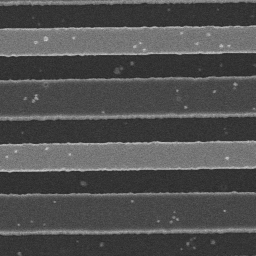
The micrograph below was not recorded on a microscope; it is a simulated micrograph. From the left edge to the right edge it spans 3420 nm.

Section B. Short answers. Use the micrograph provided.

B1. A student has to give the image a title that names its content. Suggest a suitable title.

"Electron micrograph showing lines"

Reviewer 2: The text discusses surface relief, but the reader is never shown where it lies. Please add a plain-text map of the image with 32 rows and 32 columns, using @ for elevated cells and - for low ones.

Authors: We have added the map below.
@-------------------------------
--------------------------------
--------------------------------
------@@@@@@@@@@@@@@@@@@@@@@@@@@
@@@@@@@@@@@@@@@@@@@@@@@@@@@@@@@@
@@@@@@@@@@@@@@@@@@@@@@@@@@@@@@@@
@@@@@@@@@@@@@@@@@@@@@@@@@@@@@@@@
--------------------------------
--------------------------------
--------------------------------
@@@@@@@@@@@@@@@@@@@@@@@@@@@@@@@@
@@@@@@@@@@@@@@@@@@@@@@@@@@@@@@@@
@@@@@@@@@@@@@@@@@@@@@@@@@@@@@@@@
@@@@@@@@@@@@@@@@@@@@@@@@@@@@@@@@
@@@@@@@@@@@@@@@@@@@@@@@@@@@-@---
--------------------------------
--------------------------------
--------------------------------
@@@@@@@@@@@@@@@@@@@@@@@@@@@@@@@@
@@@@@@@@@@@@@@@@@@@@@@@@@@@@@@@@
@@@@@@@@@@@@@@@@@@@@@@@@@@@@@@@@
-@------------------------------
--------------------------------
--------------------------------
@@@@@@@@@@@@@@@@@@@@@@@@@@@@@@@@
@@@@@@@@@@@@@@@@@@@@@@@@@@@@@@@@
@@@@@@@@@@@@@@@@@@@@@@@@@@@@@@@@
@@@@@@@@@@@@@@@@@@@@@@@@@@@@@@@@
@@@@@@@@@@@@@@@@@@@@@@@@@@@@@@@@
--------------------------------
--------------------------------
--------------------------------